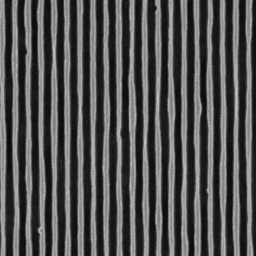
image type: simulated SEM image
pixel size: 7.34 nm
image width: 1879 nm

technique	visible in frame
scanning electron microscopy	parallel lines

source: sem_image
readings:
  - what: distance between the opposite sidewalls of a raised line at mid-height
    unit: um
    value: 0.0385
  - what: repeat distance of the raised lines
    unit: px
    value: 13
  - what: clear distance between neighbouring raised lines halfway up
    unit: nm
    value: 56.9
